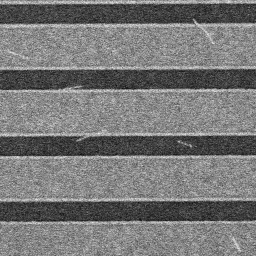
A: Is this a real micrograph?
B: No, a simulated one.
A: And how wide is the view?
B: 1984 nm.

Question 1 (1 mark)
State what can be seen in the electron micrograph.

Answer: one or a few lines or trenches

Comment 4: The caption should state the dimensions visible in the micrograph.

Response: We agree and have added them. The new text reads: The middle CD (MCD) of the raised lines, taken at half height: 43.6 pixels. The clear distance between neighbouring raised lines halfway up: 0.176 micrometres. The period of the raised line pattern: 65.8 px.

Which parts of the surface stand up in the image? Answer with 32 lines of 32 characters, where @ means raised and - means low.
--------------------------------
--------------------------------
--------------------------------
@@@@@@@@@@@@@@@@@@@@@@@@@@@@@@@@
@@@@@@@@@@@@@@@@@@@@@@@@@@@@@@@@
@@@@@@@@@@@@@@@@@@@@@@@@@@@@@@@@
@@@@@@@@@@@@@@@@@@@@@@@@@@@@@@@@
@@@@@@@@@@@@@@@@@@@@@@@@@@@@@@@@
--------------------------------
--------------------------------
--------------------------------
@@@@@@@@@@@@@@@@@@@@@@@@@@@@@@@@
@@@@@@@@@@@@@@@@@@@@@@@@@@@@@@@@
@@@@@@@@@@@@@@@@@@@@@@@@@@@@@@@@
@@@@@@@@@@@@@@@@@@@@@@@@@@@@@@@@
@@@@@@@@@@@@@@@@@@@@@@@@@@@@@@@@
@@@@@@@@@@@@@@@@@@@@@@@@@@@@@@@@
--------------------------------
--------------------------------
--------------------------------
@@@@@@@@@@@@@@@@@@@@@@@@@@@@@@@@
@@@@@@@@@@@@@@@@@@@@@@@@@@@@@@@@
@@@@@@@@@@@@@@@@@@@@@@@@@@@@@@@@
@@@@@@@@@@@@@@@@@@@@@@@@@@@@@@@@
@@@@@@@@@@@@@@@@@@@@@@@@@@@@@@@@
--------------------------------
--------------------------------
--------------------------------
@@@@@@@@@@@@@@@@@@@@@@@@@@@@@@@@
@@@@@@@@@@@@@@@@@@@@@@@@@@@@@@@@
@@@@@@@@@@@@@@@@@@@@@@@@@@@@@@@@
@@@@@@@@@@@@@@@@@@@@@@@@@@@@@@@@